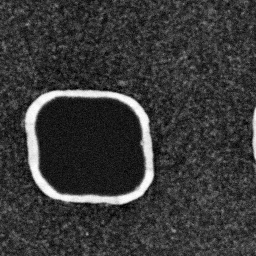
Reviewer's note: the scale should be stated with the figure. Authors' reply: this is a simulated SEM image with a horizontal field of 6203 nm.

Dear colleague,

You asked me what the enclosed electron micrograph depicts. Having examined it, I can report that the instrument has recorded raised bodies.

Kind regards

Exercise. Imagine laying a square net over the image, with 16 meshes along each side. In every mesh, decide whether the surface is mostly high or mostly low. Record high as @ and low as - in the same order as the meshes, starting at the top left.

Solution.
----------------
----------------
----------------
----------------
----------------
----------------
--@@@@@@--------
--@@@@@@@-------
--@@@@@@@-------
--@@@@@@@-------
--@@@@@@@-------
---@@@@@@-------
-------@--------
----------------
----------------
----------------